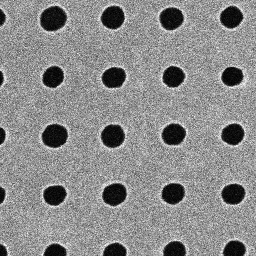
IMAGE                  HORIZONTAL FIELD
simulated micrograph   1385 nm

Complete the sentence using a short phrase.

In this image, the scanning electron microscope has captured a regular array of holes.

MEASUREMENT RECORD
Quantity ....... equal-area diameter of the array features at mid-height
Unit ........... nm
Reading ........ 118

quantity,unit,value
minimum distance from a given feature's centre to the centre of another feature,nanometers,315